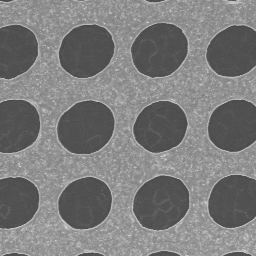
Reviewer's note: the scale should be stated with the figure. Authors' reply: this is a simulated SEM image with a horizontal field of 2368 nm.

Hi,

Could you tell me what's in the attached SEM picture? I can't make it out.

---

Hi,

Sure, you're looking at holes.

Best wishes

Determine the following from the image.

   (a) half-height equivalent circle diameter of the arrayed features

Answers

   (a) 506 nm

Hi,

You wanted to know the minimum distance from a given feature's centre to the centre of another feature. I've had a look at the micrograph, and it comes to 689 nanometers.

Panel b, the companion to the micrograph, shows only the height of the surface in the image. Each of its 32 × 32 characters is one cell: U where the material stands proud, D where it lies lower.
UUUUUUUUUUUUUUUUUUUUUUUUUUUUUUUU
UUUUUUUUUUUUUUUUUUUUUUUUUUUUUUUU
UUUUUUUUUUUUUUUUUUUUUUUUUUUUUUUU
DDDUUUUUUDDDDUUUUUDDDDUUUUUUDDDU
DDDDUUUUDDDDDDUUUDDDDDDUUUUDDDDD
DDDDDUUUDDDDDDUUUDDDDDDUUUDDDDDD
DDDDDUUDDDDDDDUUDDDDDDDUUUDDDDDD
DDDDUUUUDDDDDDUUUDDDDDDUUUDDDDDD
DDDDUUUUDDDDDUUUUDDDDDUUUUDDDDDD
DDUUUUUUUDDDUUUUUUDDDUUUUUUUDDUU
UUUUUUUUUUUUUUUUUUUUUUUUUUUUUUUU
UUUUUUUUUUUUUUUUUUUUUUUUUUUUUUUU
UDDUUUUUUUUUUUUUUUUUUUUUUUUUUDUU
DDDDUUUUUDDDDDUUUUDDDDDUUUUDDDDD
DDDDDUUUDDDDDDUUUDDDDDDUUUDDDDDD
DDDDDUUDDDDDDDUUUDDDDDDUUUDDDDDD
DDDDDUUDDDDDDDUUUDDDDDDUUUDDDDDD
DDDDUUUDDDDDDDUUUDDDDDDUUUDDDDDD
DDDUUUUUDDDDDUUUUUDDDDUUUUUDDDDU
UUUUUUUUUUUUUUUUUUUUUUUUUUUUUUUU
UUUUUUUUUUUUUUUUUUUUUUUUUUUUUUUU
UUUUUUUUUUUUUUUUUUUUUUUUUUUUUUUU
DDDUUUUUUUDDDUUUUUUDDDUUUUUDDDDD
DDDDDUUUDDDDDDUUUDDDDDDUUUUDDDDD
DDDDDUUUDDDDDDUUUDDDDDDDUUDDDDDD
DDDDDUUDDDDDDDUUUDDDDDDDUUDDDDDD
DDDDDUUDDDDDDDUUUDDDDDDUUUDDDDDD
DDDDUUUUDDDDDUUUUDDDDDDUUUUDDDDD
DDUUUUUUUDDUUUUUUUDDDUUUUUUUDUUU
UUUUUUUUUUUUUUUUUUUUUUUUUUUUUUUU
UUUUUUUUUUUUUUUUUUUUUUUUUUUUUUUU
UUUUUUUUUUUUUUUUUUUUDUUUUUUUUDUU